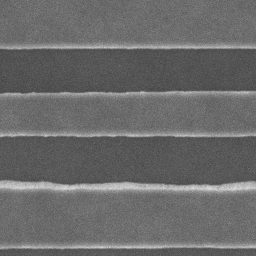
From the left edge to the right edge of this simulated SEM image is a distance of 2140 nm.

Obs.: lines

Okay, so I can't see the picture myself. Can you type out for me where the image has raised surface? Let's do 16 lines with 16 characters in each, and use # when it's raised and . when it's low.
################
################
################
................
................
................
################
################
#.#.##.###.#####
................
................
................
################
################
################
................